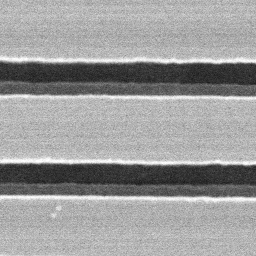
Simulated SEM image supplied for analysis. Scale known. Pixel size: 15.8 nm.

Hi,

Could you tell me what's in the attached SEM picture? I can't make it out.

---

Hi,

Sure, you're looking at lines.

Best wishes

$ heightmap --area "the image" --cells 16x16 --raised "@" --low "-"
@@@@@@@@@@@@@@@@
@@@@@@@@@@@@@@@@
@@@@@@@@@@@@@@@@
@@@@@@@@@@@@@@@@
----------------
----------------
@@@@@@@@@@@@@@@@
@@@@@@@@@@@@@@@@
@@@@@@@@@@@@@@@@
@@@@@@@@@@@@@@@@
----------------
----------------
@@@@@@@@@@@@@@@@
@@@@@@@@@@@@@@@@
@@@@@@@@@@@@@@@@
@@@@@@@@@@@@@@@@